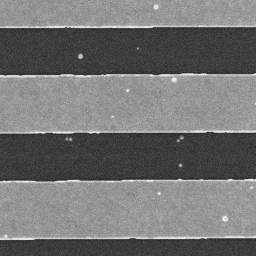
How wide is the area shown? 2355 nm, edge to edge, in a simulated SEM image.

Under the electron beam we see lines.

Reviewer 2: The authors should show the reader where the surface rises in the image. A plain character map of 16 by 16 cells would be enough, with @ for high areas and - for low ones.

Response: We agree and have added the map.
@@@@@@@@@@@@@@@@
@@@@@@@@@@@@@@@@
----------------
----------------
----------------
@@@@@@@@@@@@@@@@
@@@@@@@@@@@@@@@@
@@@@@@@@@@@@@@@@
----------------
----------------
----------------
@@@@@@@@@@@@@@@@
@@@@@@@@@@@@@@@@
@@@@@@@@@@@@@@@@
@@@@@@@@@@@@@@@@
----------------